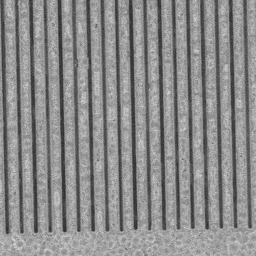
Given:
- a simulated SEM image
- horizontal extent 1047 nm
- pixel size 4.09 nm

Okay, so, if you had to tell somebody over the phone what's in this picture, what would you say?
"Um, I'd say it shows parallel lines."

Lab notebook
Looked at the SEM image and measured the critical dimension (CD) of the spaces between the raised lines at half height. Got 16.4 nm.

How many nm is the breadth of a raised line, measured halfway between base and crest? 40.9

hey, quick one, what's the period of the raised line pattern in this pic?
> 58.3 nm